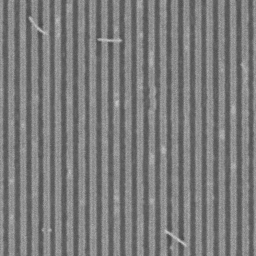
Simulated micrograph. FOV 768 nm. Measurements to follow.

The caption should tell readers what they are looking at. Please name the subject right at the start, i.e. parallel lines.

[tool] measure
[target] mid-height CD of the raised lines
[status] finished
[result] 5.77 pixels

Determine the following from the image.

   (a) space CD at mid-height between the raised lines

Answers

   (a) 17.3 nm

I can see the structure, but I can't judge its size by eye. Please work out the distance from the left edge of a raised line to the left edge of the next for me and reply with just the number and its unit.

11.7 pixels